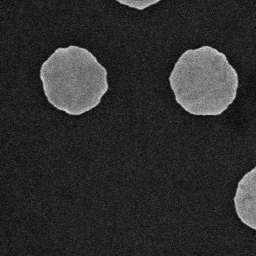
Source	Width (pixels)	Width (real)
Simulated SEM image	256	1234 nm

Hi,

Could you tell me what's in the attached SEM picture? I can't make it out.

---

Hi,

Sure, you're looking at raised bodies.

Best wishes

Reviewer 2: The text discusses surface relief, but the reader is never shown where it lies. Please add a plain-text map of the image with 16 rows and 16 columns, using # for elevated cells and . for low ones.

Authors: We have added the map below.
................
................
................
...###.....###..
...####....####.
...####....####.
...###.....###..
................
................
................
................
...............#
...............#
...............#
................
................